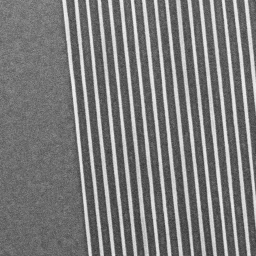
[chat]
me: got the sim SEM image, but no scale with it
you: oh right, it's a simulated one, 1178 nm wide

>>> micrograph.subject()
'parallel lines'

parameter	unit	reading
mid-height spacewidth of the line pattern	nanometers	39.5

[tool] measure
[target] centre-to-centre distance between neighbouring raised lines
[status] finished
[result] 11.3 pixels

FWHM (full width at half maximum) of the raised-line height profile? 2.87 pixels